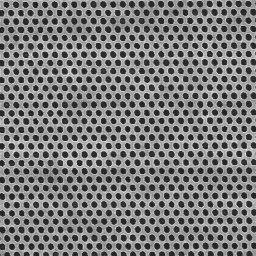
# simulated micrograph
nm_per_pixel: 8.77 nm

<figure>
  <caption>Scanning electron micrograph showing a regular array of holes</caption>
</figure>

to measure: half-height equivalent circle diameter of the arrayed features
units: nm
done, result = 57.7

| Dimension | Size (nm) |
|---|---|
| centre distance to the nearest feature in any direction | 82.4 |